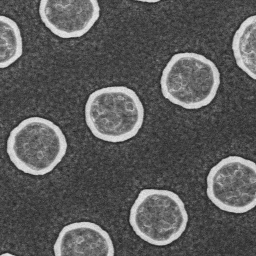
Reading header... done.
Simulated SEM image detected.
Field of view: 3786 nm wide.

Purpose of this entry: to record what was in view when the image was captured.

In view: raised bodies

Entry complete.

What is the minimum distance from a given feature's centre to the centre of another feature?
1.23 microns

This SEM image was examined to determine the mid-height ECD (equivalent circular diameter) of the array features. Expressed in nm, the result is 777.